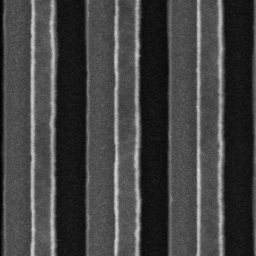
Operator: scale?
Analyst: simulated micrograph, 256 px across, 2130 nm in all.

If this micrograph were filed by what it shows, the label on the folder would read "lines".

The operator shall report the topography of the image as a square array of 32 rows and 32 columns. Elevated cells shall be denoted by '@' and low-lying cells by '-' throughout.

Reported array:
-@@@@@@----@@@@@@----@@@@@@@----
-@@@@@@----@@@@@@----@@@@@@@----
-@@@@@@----@@@@@@----@@@@@@@----
-@@@@@@----@@@@@@----@@@@@@@----
-@@@@@@----@@@@@@----@@@@@@@----
-@@@@@@----@@@@@@----@@@@@@@----
-@@@@@@----@@@@@@----@@@@@@@----
-@@@@@@----@@@@@@----@@@@@@@----
-@@@@@@----@@@@@@----@@@@@@@----
-@@@@@@----@@@@@@----@@@@@@@----
-@@@@@@----@@@@@@----@@@@@@@----
-@@@@@@----@@@@@@----@@@@@@@----
-@@@@@@----@@@@@@----@@@@@@@----
-@@@@@@----@@@@@@----@@@@@@@----
-@@@@@@----@@@@@@----@@@@@@@----
-@@@@@@----@@@@@@----@@@@@@@----
-@@@@@@----@@@@@@----@@@@@@@----
-@@@@@@----@@@@@@----@@@@@@@----
-@@@@@@----@@@@@@----@@@@@@@----
-@@@@@@----@@@@@@----@@@@@@@----
-@@@@@@----@@@@@@----@@@@@@@----
-@@@@@@----@@@@@@----@@@@@@@----
-@@@@@@----@@@@@@----@@@@@@@----
-@@@@@@----@@@@@@----@@@@@@@----
-@@@@@@----@@@@@@----@@@@@@@----
-@@@@@@----@@@@@@----@@@@@@@----
-@@@@@@----@@@@@@----@@@@@@@----
-@@@@@@----@@@@@@----@@@@@@@----
-@@@@@@----@@@@@@----@@@@@@@----
-@@@@@@----@@@@@@----@@@@@@@----
-@@@@@@----@@@@@@----@@@@@@@----
-@@@@@@----@@@@@@----@@@@@@@----